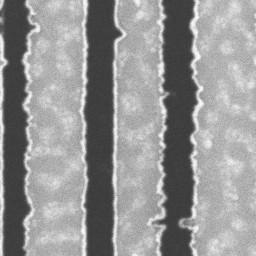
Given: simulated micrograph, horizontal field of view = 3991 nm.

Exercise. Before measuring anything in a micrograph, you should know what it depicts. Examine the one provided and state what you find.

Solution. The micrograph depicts one or a few lines or trenches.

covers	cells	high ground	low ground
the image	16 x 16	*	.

**...**...**....
**...**...**....
**...**...**....
**...**...**....
**...**...**....
**...**...**....
**...**...**....
**...**...**....
**...**...**....
**...**...**....
**...**...**....
**...**...**....
**...**...**....
**...**...**....
**...**...**....
**...**...**....